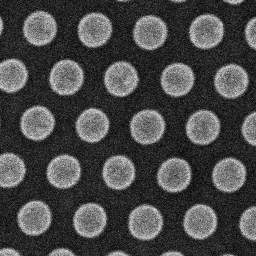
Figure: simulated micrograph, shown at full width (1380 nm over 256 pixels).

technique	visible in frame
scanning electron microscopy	a regular array of raised bodies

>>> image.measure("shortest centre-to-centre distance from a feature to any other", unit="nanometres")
292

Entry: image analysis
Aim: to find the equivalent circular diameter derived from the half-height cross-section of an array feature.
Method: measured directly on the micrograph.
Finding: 170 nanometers